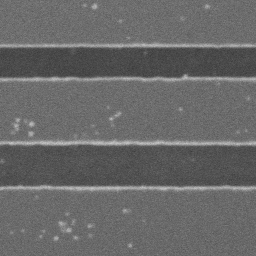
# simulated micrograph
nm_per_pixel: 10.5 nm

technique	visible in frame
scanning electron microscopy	lines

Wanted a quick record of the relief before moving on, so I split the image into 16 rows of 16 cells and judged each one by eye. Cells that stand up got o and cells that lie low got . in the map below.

oooooooooooooooo
oooooooooooooooo
oooooooooooooooo
................
................
oooooooooooooooo
oooooooooooooooo
oooooooooooooooo
oooooooooooooooo
................
................
................
oooooooooooooooo
oooooooooooooooo
oooooooooooooooo
oooooooooooooooo